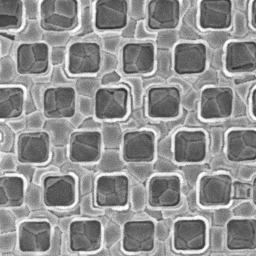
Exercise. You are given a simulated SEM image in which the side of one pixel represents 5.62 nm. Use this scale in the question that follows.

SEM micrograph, a regular array of holes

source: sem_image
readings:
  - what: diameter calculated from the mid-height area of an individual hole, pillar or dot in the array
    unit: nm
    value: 194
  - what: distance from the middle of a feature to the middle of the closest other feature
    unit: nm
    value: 285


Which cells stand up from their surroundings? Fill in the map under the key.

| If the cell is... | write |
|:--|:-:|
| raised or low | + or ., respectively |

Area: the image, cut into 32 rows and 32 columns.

...++.....++....+++...+++....+++
...++.....++....++....+++....++.
...++.....++....++....+++....++.
..+++....+++...++++...+++...++++
++++++++++++++++++++++++++++++++
+++...+++...++++...+++...++++...
++....+++....++....+++....++....
++....+++....++....+++....++....
++....+++...+++....+++....++....
++++++++++++++++++++++++++++++++
++++++++++++++++++++++++++++++++
...+++...+++....+++...+++....+++
...++....+++....+++....++....+++
...++....+++....++.....++....+++
..++++...+++....+++...+++....+++
++++++++++++++++++++++++++++++++
++++.++++...++++...+++...++++...
++....+++....++....+++....++....
++....+++....++....+++....++....
++....+++....++....+++....++....
++++++++++++++++++++++++++++++++
++++++++++++++++++++++++++++++++
...+++...+++....+++...+++....+++
...++....+++....+++....++.......
...++....+++....+++....++.......
...+++...+++....+++...+++...++++
++++++++++++++++++++++++++++++++
++++++++++..+++++++++++..++++...
++....+++....++....+++....++....
++....+++....++....+++....++....
++....+++....++....+++....++....
+++..+++++++++++.+++++++++++++++